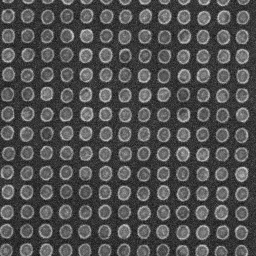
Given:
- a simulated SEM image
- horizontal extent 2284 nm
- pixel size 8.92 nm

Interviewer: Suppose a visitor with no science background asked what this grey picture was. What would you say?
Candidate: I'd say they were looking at a regular array of raised bodies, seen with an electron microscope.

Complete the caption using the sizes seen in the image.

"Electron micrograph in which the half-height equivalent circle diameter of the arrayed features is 113 nm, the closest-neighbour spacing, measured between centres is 168 nanometers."